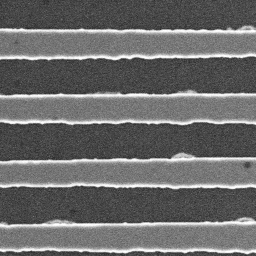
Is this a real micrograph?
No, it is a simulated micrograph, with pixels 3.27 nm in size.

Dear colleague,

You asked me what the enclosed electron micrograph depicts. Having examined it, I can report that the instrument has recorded lines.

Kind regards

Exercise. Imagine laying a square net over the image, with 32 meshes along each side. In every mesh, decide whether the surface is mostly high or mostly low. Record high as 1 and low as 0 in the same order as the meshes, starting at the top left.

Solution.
00000000000000000000000000000000
00000000000000000000000000000000
00000000000000000000000000000000
00000000000000000000000000000000
11111111111111111111111111111111
11111111111111111111111111111111
11111111111111111111111111111111
00000000000000000000000000000000
00000000000000000000000000000000
00000000000000000000000000000000
00000000000000000000000000000000
00000000000000000000000000000000
11111111111111111111111111111111
11111111111111111111111111111111
11111111111111111111111111111111
00000000010000000000001100000001
00000000000000000000000000000000
00000000000000000000000000000000
00000000000000000000000000000000
00000000000000000000000000000000
11111111111111111111111111111111
11111111111111111111111111111111
11111111111111111111111111111111
00000000000000000000011000001100
00000000000000000000000000000000
00000000000000000000000000000000
00000000000000000000000000000000
00000000000000000000000000000000
11111111111111111111111111111111
11111111111111111111111111111111
11111111111111111111111111111111
00000000000001110000001100011011